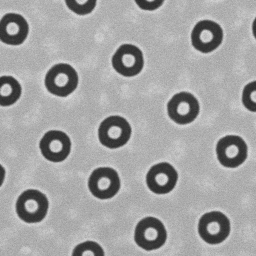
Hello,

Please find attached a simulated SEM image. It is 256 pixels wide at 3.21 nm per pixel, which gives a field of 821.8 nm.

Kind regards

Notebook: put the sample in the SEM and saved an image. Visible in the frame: a regular array of ring-shaped grooves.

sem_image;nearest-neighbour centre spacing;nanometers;207